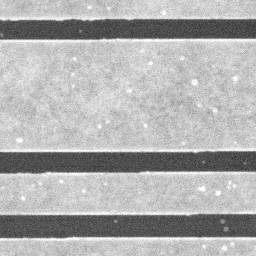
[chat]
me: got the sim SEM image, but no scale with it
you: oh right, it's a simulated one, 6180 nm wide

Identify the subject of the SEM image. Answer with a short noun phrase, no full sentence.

lines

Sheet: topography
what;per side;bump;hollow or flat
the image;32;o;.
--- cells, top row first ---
oooooooooooooooooooooooooooooooo
oooooooooooooooooooooooooooooooo
................................
................................
................................
oooooooooooooooooooooooooooooooo
oooooooooooooooooooooooooooooooo
oooooooooooooooooooooooooooooooo
oooooooooooooooooooooooooooooooo
oooooooooooooooooooooooooooooooo
oooooooooooooooooooooooooooooooo
oooooooooooooooooooooooooooooooo
oooooooooooooooooooooooooooooooo
oooooooooooooooooooooooooooooooo
oooooooooooooooooooooooooooooooo
oooooooooooooooooooooooooooooooo
oooooooooooooooooooooooooooooooo
oooooooooooooooooooooooooooooooo
oooooooooooooooooooooooooooooooo
................................
................................
................................
oooooooooooooooooooooooooooooooo
oooooooooooooooooooooooooooooooo
oooooooooooooooooooooooooooooooo
oooooooooooooooooooooooooooooooo
oooooooooooooooooooooooooooooooo
................................
................................
................................
oooooooooooooooooooooooooooooooo
oooooooooooooooooooooooooooooooo